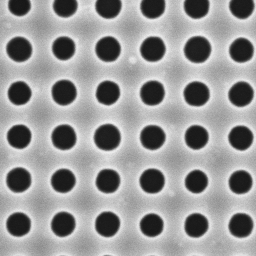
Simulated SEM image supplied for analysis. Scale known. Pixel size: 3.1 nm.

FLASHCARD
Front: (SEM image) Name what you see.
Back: a regular array of holes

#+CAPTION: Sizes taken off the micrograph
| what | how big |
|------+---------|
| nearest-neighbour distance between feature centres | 135 nm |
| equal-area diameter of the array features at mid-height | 0.0719 um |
